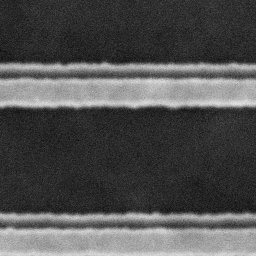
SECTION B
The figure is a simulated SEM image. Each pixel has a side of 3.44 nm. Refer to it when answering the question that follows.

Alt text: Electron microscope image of lines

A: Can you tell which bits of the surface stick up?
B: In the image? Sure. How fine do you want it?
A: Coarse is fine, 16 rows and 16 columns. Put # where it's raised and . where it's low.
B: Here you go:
................
................
................
................
################
################
#########.######
................
................
................
................
................
................
........#.....#.
################
################